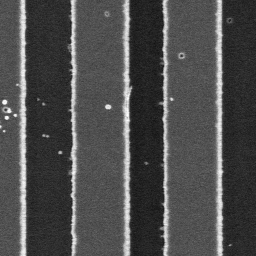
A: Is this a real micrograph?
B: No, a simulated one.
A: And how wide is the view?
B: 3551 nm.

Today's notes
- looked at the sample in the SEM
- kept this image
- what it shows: lines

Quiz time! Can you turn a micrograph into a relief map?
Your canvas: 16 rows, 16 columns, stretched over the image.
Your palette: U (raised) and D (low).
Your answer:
UUDDUUUUDDUUUUDD
UUDDDUUUDDUUUUDD
UUDDUUUUDDUUUUDD
UUDDDUUUDDUUUUDD
UUDDDUUUDDUUUUDD
UUDDUUUUDDUUUUDD
UUDDUUUUDDUUUUDD
UUDDDUUUDDUUUUDD
UUDDDUUUDDUUUUDD
UUDDDUUUDDUUUUDD
UUDDDUUUDDUUUUDD
UUDDDUUUDDUUUUDD
UUDDDUUUDDUUUUDD
UUDDDUUUDDUUUUDD
UUDDDUUUDDUUUUDD
UUDDDUUUDDUUUUDD